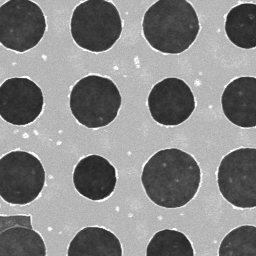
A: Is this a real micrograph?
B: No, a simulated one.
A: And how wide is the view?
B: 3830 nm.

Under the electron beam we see holes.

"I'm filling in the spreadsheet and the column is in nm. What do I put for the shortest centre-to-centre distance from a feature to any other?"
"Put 1140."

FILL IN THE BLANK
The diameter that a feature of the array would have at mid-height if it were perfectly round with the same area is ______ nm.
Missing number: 738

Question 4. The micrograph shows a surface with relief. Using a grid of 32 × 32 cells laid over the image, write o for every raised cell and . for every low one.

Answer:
....oooooo....ooooo.....oooooo..
.....oooo......ooo......ooooo...
......ooo......ooo.......ooo....
......ooo......ooo.......ooo....
.....oooo......ooo.......ooo....
.....ooooo....ooooo.....ooooo...
oooooooooooooooooooo...ooooooooo
oooooooooooooooooooooooooooooooo
oooooooooooooooooooooooooooooooo
ooooooooooo.oooooooooooooooooooo
....ooooo.....oooooo...oooooo...
.....oooo......oooo.....oooo....
.....oooo......oooo.....oooo....
.....oooo......oooo.....oooo....
.....oooo......oooo.....oooo....
oo.ooooooo...ooooooo..ooooooo...
oooooooooooooooooooooooooooooooo
oooooooooooooooooooooooooooooooo
ooooooooooooooooooooooooooooooo.
o...ooooooo..oooooo.....oooo....
.....ooooo....oooo.......oo.....
......ooo.....oooo.......oo.....
......ooo......ooo.......oo.....
.....oooo.....oooo.......oo.....
.....ooooo...oooooo.....oooo....
oo.ooooooooooooooooo...oooooo...
oooooooooooooooooooooooooooooooo
....oooooooooooooooooooooooooooo
....ooooooo..ooooooooooooooooo..
.....oooo.....ooooo....ooooo....
......ooo......oooo.....oooo....
......oo.......ooo......ooo.....